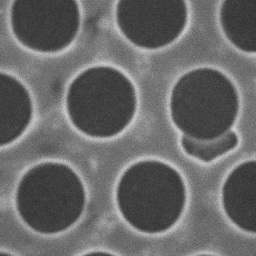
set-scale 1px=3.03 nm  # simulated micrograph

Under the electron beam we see holes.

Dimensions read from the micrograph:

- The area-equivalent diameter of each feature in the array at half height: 70.2 px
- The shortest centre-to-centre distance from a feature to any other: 302 nm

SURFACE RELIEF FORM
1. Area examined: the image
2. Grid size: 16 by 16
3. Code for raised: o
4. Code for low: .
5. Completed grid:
o....oo.....oo..
o....oo.....oo..
o....ooo...ooo..
oooooooooooooooo
ooooo..ooooo..oo
..oo....ooo....o
..oo....ooo....o
..oo....ooo....o
.ooooo.oooo....o
oooooooooooo..oo
oo..oooo...oooo.
o....oo....ooo..
o....oo.....oo..
o....ooo...ooo..
oo..ooooo.oooooo
oooooooooooooooo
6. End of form